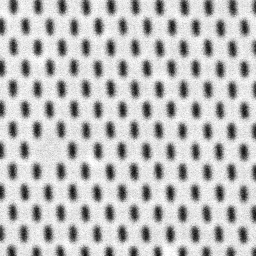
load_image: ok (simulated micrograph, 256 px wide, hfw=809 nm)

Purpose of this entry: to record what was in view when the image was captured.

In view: a regular array of holes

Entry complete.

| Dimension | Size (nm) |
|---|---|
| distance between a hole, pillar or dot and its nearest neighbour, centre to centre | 74.2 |